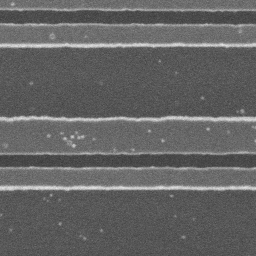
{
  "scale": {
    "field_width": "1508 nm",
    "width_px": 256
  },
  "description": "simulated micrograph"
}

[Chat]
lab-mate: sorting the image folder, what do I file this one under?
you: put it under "lines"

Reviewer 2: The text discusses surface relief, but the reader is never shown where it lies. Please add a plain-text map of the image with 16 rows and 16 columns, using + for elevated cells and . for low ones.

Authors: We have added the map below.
++++++++++++++++
++++++++++++++++
++++++++++++++++
................
................
................
................
++++++++++++++++
++++++++++++++++
++++++++++++++++
++++++++++++++++
++++++++++++++++
................
................
................
................